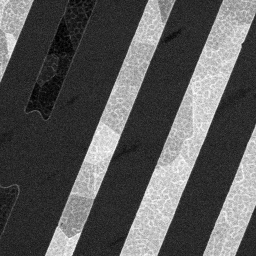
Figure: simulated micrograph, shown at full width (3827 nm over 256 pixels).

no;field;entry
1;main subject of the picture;one or a few lines or trenches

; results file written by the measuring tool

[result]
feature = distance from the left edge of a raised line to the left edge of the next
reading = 1.1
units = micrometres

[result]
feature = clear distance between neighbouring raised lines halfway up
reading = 0.668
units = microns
